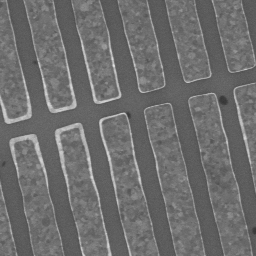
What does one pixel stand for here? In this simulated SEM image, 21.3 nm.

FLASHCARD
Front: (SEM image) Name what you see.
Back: groups of lines, slits or small figures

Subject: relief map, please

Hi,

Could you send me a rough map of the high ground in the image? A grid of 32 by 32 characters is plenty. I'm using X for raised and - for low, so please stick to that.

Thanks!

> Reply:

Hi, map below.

X--XXXX--XXXX--XXX---XXX---XXX--
X--XXXX--XXXX--XXXX--XXXX--XXX--
X---XXX--XXXX--XXXX--XXXX--XXXX-
XX--XXX---XXX---XXX--XXXX--XXXX-
XX--XXXX--XXXX--XXX---XXX---XXX-
XX--XXXX--XXXX--XXXX--XXXX--XXX-
XX--XXXX--XXXX--XXXX--XXXX--XXXX
XX---XXX---XXX---XXX--XXXX--XXXX
XXX--XXX---XXX---XXX---XXX---XX-
XXX--XXXX--XXX---XXX---XXX------
XXX--XXXX--XXXX--XXXX----------X
XXX---XXX---XXX--------------XXX
XXXX--XXX---XX----------XXX--XXX
XXXX--XXX----------XX---XXX---XX
-XX-----------XX--XXXX--XXXX--XX
-------------XXX--XXXX--XXXX--XX
-------XXX---XXX--XXXX--XXXX--XX
--XX---XXXX--XXX---XXX---XXX---X
-XXXX---XXX--XXXX--XXXX--XXXX--X
--XXX---XXX---XXX--XXXX--XXXX--X
--XXX---XXX---XXX---XXX--XXXX--X
--XXXX--XXX---XXX---XXX---XXX---
--XXXX--XXXX--XXX---XXXX--XXX---
---XXX--XXXX--XXXX--XXXX--XXXX--
---XXX---XXX---XXX--XXXX--XXXX--
X--XXXX--XXXX--XXX---XXX--XXXX--
X--XXXX--XXXX--XXX---XXX---XXX--
X--XXXX--XXXX--XXXX--XXXX--XXXX-
X---XXX---XXX--XXXX--XXXX--XXXX-
XX--XXX---XXX---XXX--XXXX--XXXX-
XX--XXXX--XXXX--XXXX--XXX---XXX-
XX--XXXX--XXXX--XXXX--XXXX--XXX-